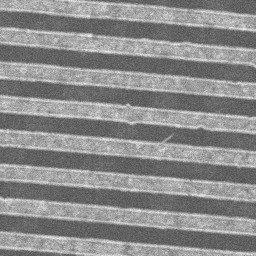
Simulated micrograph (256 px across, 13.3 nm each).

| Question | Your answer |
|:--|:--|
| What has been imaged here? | parallel lines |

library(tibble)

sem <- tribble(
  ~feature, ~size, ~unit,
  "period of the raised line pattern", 0.453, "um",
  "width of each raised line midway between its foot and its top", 186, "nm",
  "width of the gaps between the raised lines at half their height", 0.273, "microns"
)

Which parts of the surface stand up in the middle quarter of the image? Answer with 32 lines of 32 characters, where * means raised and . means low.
................................
***.............................
******************..............
*****************************...
*.******************************
..............******************
..........................******
................................
................................
................................
************....................
**********************..........
********************************
.........***********************
................**...***********
..............................**
................................
................................
*****...........................
*****************...............
*****************************...
..******************************
.............*******************
.......................*.*******
................................
................................
................................
**********......................
*********************...........
*******************************.
......**************************
..................*.************